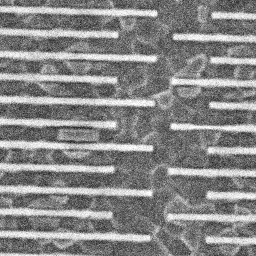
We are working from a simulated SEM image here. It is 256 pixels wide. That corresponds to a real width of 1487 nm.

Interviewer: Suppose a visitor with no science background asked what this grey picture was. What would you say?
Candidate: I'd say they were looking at parallel lines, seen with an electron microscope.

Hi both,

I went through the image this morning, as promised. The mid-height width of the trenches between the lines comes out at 98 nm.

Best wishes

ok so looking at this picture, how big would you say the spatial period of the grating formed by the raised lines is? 131 nm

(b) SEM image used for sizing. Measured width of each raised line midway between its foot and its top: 0.0298 microns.